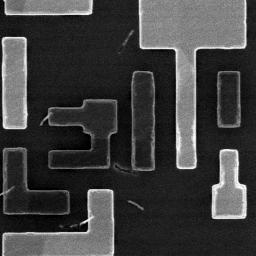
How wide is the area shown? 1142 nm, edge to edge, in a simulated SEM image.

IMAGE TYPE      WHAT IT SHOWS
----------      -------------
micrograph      wiring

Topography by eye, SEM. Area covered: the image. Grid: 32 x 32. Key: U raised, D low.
DUUUUUUUUUUDDDDDDUUUUUUUUUUUUUUD
DUUUUUUUUUUDDDDDDUUUUUUUUUUUUUUD
DDDDDDDDDDDDDDDDDDUUUUUUUUUUUUUD
DDDDDDDDDDDDDDDDDDUUUUUUUUUUUUUD
DDDDDDDDDDDDDDDDDDUUUUUUUUUUUUUD
UUUDDDDDDDDDDDDDDDUUUUUUUUUUUUUD
UUUDDDDDDDDDDDDDDDDDDDUUUDDDDDDD
UUUDDDDDDDDDDDDDDDDDDDUUDDDDDDDD
UUUDDDDDDDDDDDDDDDDDDDUUDDDDDDDD
UUUDDDDDDDDDDDDDDUUDDDUUDDDUUUDD
UUUDDDDDDDDDDDDDUUUDDDUUDDDUUUDD
UUUDDDDDDDDDDDDDUUUDDDUUDDDUUUDD
UUUDDDDDDDDDDDDDUUUDDDUUDDDUUUDD
UUUDDDUUUUUUUUUDUUUDDDUUDDDUUUDD
UUUDDDUUUUUUUUUDDUUDDDUUDDDUUUDD
UUUDDDUUUUUUUUUDDUUDDDUUDDDUUUDD
DDDDDDDDDDDUUUDDDUUDDDUUDDDDDDDD
DDDDDDDDDDDUUUDDDUUDDDUUDDDDDDDD
DDUDDDDDDDDUUUDDDUUDDDUUDDDDDDDD
UUUDDDUUUUUUUUDDUUUDDDUUDDDDUUDD
UUUDDDUUUUUUUUDDUUUDDDUUUDDDUUDD
UUUDDDDDDDDDDDDDDDDDDDDDDDDDUUDD
UUUDDDDDDDDDDDDDDDDDDDDDDDDUUUDD
UUUUDDDDDDDDDDDDDDDDDDDDDDDUUUUD
UUUUUUUUUDDUUUDDDDDDDDDDDDDUUUUD
DUUUUUUUUDDUUUDDDDDDDDDDDDDUUUUD
DUUUUUUUDDDUUUDDDDDDDDDDDDDUUUUD
DDDDDDDDDDDUUUDDDDDDDDDDDDDDDDDD
DDDDDDDDDDDUUUDDDDDDDDDDDDDDDDDD
UUUUUUUUUUUUUUDDDDDDDDDDDDDDDDDD
UUUUUUUUUUUUUUDDDDDDDDDDDDDDDDDD
UUUUUUUUUUUUUUDDDDDDDDDDDDDDDDDD